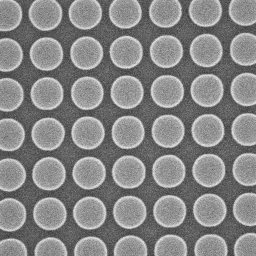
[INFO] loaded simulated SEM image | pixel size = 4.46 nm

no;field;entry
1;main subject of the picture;an array of small figures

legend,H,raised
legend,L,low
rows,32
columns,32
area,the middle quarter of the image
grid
LLLHHHHHLLLLLHHHHHLLLLLLHHHLLLLL
LLLLLLLLLLLLLLLLLLLLLLLLLLLLLLLL
LLLLLLLLLLLLLLLLLLLLLLLLLLLLLLLL
LLLLHHHLLLLLLHHHHHLLLLLHHHHHLLLL
LLLHHHHHHLLLHHHHHHHLLLHHHHHHHLLL
LLHHHHHHHLLLHHHHHHHHLLHHHHHHHHLL
LLHHHHHHHHLLHHHHHHHHLLHHHHHHHHLL
LLHHHHHHHHLLHHHHHHHHLLHHHHHHHHLL
LLHHHHHHHHLLHHHHHHHHLLHHHHHHHHLL
LLHHHHHHHLLLHHHHHHHLLLLHHHHHHLLL
LLLHHHHHLLLLLLHHHHLLLLLLHHHHLLLL
LLLLLLLLLLLLLLLLLLLLLLLLLLLLLLLL
LLLLLLLLLLLLLLLLLLLLLLLLLLLLLLLL
LLLLHHHLLLLLLLHHHHLLLLLHHHHHLLLL
LLLHHHHHHLLLLHHHHHHLLLLHHHHHHLLL
LLHHHHHHHHLLHHHHHHHHLLHHHHHHHHLL
LLHHHHHHHHLLHHHHHHHHLLHHHHHHHHLL
LLHHHHHHHHLLHHHHHHHHLLHHHHHHHHLL
LLHHHHHHHHLLHHHHHHHHLLHHHHHHHHLL
LLHHHHHHHLLLLHHHHHHLLLLHHHHHHLLL
LLLLHHHHHLLLLLHHHHLLLLLLHHHHLLLL
LLLLLLLLLLLLLLLLLLLLLLLLLLLLLLLL
LLLLLLLLLLLLLLLLLLLLLLLLLLLLLLLL
LLLLLHHHLLLLLLHHHHLLLLLLHHHHHLLL
LLLHHHHHHLLLLHHHHHHLLLLHHHHHHLLL
LLLHHHHHHHLLHHHHHHHHLLHHHHHHHHLL
LLHHHHHHHHLLHHHHHHHHLLHHHHHHHHLL
LLHHHHHHHHLLHHHHHHHHLLHHHHHHHHLL
LLHHHHHHHHLLHHHHHHHHLLLHHHHHHHLL
LLLHHHHHHHLLLHHHHHHHLLLHHHHHHHLL
LLLLHHHHHLLLLLHHHHLLLLLLHHHHLLLL
LLLLLLLLLLLLLLLLLLLLLLLLLLLLLLLL